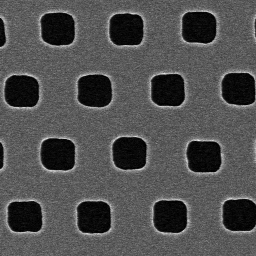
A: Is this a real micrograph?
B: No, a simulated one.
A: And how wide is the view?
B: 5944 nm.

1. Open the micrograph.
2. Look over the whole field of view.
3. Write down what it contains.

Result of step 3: a regular array of holes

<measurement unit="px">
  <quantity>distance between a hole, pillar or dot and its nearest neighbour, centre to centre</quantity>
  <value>69.3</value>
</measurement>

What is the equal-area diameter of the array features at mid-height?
833 nm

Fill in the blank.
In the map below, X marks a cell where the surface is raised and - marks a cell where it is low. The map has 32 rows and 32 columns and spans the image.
XXXXXXXXXXXXXXXXXXXXXXXXXXXXXXXX
XXXXXXXXXXXXXXXXXXXXXXXX-XXXXXXX
XXXXX----XXXXX----XXXXX----XXXXX
-XXXX----XXXXX----XXXXX----XXXXX
-XXXX----XXXXX----XXXXX----XXXXX
-XXXXX---XXXXX---XXXXXXXXXXXXXXX
XXXXXXXXXXXXXXXXXXXXXXXXXXXXXXXX
XXXXXXXXXXXXXXXXXXXXXXXXXXXXXXXX
XXXXXXXXXXXXXXXXXXXXXXXXXXXXXXXX
X---XXXXXXX--XXXXXX----XXXXX---X
X----XXXXX----XXXXX----XXXXX----
-----XXXXX----XXXXX----XXXXX----
X----XXXXX----XXXXX----XXXXX----
XXXXXXXXXXXXXXXXXXXXXXXXXXXXXXXX
XXXXXXXXXXXXXXXXXXXXXXXXXXXXXXXX
XXXXXXXXXXXXXXXXXXXXXXXXXXXXXXXX
XXXXXXXXXXXXXXXXXXXXXXXXXXXXXXXX
XXXXXX---XXXXX----XXXXXXXXXXXXXX
XXXXX----XXXXX----XXXXX-----XXXX
-XXXX----XXXXX----XXXXX-----XXXX
XXXXX----XXXXX----XXXXXX----XXXX
XXXXXXXXXXXXXXXXXXXXXXXX---XXXXX
XXXXXXXXXXXXXXXXXXXXXXXXXXXXXXXX
XXXXXXXXXXXXXXXXXXXXXXXXXXXXXXXX
XXXXXXXXXXXXXXXXXXXXXXXXXXXXXXXX
X----XXXXX---XXXXXX----XXXXX----
X----XXXXX----XXXXX----XXXXX----
X----XXXXX----XXXXX----XXXXX----
X----XXXXX----XXXXX----XXXXX----
XXXXXXXXXXXXXXXXXXXXXXXXXXXXXXXX
XXXXXXXXXXXXXXXXXXXXXXXXXXXXXXXX
XXXXXXXXXXXXXXXXXXXXXXXXXXXXXXXX